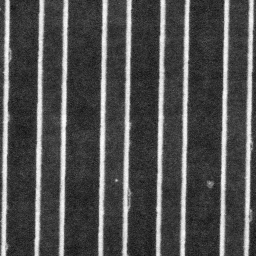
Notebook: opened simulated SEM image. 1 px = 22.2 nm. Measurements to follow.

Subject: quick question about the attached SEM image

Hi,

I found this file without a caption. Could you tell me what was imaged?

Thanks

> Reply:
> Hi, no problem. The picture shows lines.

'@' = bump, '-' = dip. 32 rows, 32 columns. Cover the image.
@----@@@-----@@@----@@@-----@@@-
@----@@@-----@@@----@@@-----@@@-
@----@@@-----@@@----@@@-----@@@-
@----@@@-----@@@----@@@-----@@@-
@----@@@-----@@@----@@@-----@@@-
@----@@@-----@@@----@@@-----@@@-
@----@@@-----@@@----@@@-----@@@-
@----@@@-----@@@----@@@-----@@@-
@----@@@-----@@@----@@@-----@@@-
@----@@@-----@@@----@@@-----@@@-
@----@@@-----@@@----@@@-----@@@-
@----@@@-----@@@----@@@-----@@@-
@----@@@-----@@@----@@@-----@@@-
@----@@@-----@@@----@@@-----@@@-
@----@@@-----@@@----@@@-----@@@-
@----@@@-----@@@----@@@-----@@@-
@----@@@-----@@@----@@@-----@@@-
@----@@@-----@@@----@@@-----@@@-
@----@@@-----@@@----@@@-----@@@-
@----@@@-----@@@----@@@-----@@@-
@----@@@-----@@@----@@@-----@@@-
@----@@@-----@@@----@@@-----@@@-
@----@@@-----@@@----@@@-----@@@-
@----@@@-----@@@----@@@-----@@@-
@----@@@-----@@@----@@@-----@@@-
@----@@@-----@@@----@@@-----@@@-
@----@@@-----@@@----@@@-----@@@-
@----@@@-----@@@----@@@-----@@@-
-----@@@-----@@@----@@@-----@@@-
-----@@@-----@@@----@@@-----@@@-
-----@@@-----@@@----@@@-----@@@-
-----@@@-----@@@----@@@-----@@@-